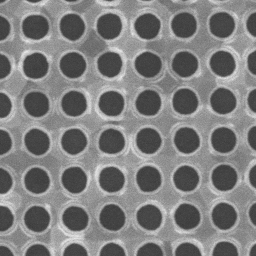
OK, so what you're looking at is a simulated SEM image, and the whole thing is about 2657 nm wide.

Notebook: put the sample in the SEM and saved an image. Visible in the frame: a regular array of holes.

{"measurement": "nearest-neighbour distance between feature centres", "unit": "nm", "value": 384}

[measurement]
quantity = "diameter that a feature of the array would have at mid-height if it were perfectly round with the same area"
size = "288 nanometres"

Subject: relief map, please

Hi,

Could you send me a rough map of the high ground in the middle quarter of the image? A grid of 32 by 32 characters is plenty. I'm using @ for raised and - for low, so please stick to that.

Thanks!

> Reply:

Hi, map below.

------@@-------@@--------@@-----
------@@-------@@@------@@@-----
-----@@@@-----@@@@@-----@@@@----
@---@@@@@@---@@@@@@@---@@@@@@--@
@@@@@@@@@@@@@@@@@@@@@@@@@@@@@@@@
@@@@@@@@@@@@@@@@@@@@@@@@@@@@@@@@
@@-@@@@@@@@--@@@@@@@---@@@@@----
-----@@@@------@@@------@@@-----
------@@@------@@@------@@@-----
------@@-------@@@-------@@-----
------@@-------@@@-------@@-----
------@@@------@@@------@@@-----
-----@@@@@----@@@@@----@@@@@----
@@@@@@@@@@@@-@@@@@@@@@@@@@@@@@@@
@@@@@@@@@@@@--@@@@@@@@@@@@@@@@@@
@@@@@@@@@@@@@@@@@@@@@@@@@@@@@@-@
@---@@@@@@----@@@@@----@@@@@----
-----@@@@------@@@------@@@@----
------@@@------@@@------@@@-----
------@@--------@@-------@@-----
------@@-------@@@-------@@@----
-----@@@@------@@@------@@@@----
@---@@@@@@----@@@@@@--@@@@@@@---
@@@@@@@@@@@@@@@@@@@@@@@@@@@@@@@@
@@@@@@@@@@@@@@@@@@@@@@@@@@@@@@@@
@@--@@@@@@@--@@@@@@----@@@@@@---
-----@@@@-----@@@@------@@@@----
------@@@------@@@------@@@-----
------@@-------@@@-------@@-----
------@@-------@@@-------@@-----
------@@@------@@@------@@@@----
-----@@@@@----@@@@@----@@@@@----